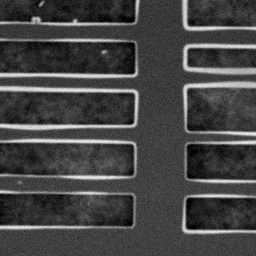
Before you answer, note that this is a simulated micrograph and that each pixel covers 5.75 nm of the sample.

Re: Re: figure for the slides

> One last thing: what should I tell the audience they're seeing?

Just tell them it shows groups of lines, slits or small figures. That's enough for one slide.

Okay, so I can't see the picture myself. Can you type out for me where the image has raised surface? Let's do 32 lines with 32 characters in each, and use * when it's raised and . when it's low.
.................******.........
.................******.........
.................******.........
************************........
********************************
.................***************
.................******.........
.................******.........
.................*******........
**********......****************
********************************
.................******.........
.................******.........
.................******.........
.................******.........
.................******.........
************************........
********************************
.................******.........
.................******.........
.................******.........
.................******.........
*************************.......
********************************
................****************
.................******.........
.................******.........
.................******.........
***********************.........
********************************
********************************
********************************